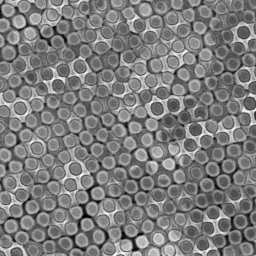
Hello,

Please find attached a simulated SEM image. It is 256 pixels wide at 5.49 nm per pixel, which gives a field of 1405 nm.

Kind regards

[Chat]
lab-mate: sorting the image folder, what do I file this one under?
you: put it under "a regular array of raised bodies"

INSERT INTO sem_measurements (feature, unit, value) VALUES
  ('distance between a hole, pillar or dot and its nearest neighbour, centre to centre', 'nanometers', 86.7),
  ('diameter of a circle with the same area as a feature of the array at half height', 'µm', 0.0594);